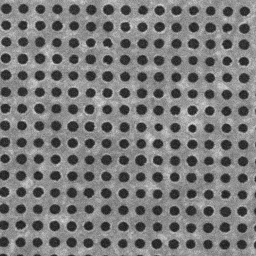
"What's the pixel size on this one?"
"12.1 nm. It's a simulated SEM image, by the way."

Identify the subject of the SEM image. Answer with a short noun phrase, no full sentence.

a regular array of holes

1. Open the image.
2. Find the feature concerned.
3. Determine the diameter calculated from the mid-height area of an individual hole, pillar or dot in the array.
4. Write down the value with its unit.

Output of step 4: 126 nanometres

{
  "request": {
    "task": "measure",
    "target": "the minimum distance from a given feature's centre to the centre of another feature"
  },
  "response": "199 nanometers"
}